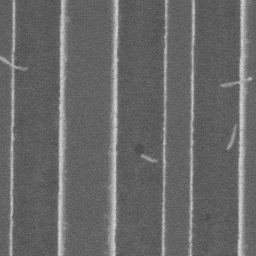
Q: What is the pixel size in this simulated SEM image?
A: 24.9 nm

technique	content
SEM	lines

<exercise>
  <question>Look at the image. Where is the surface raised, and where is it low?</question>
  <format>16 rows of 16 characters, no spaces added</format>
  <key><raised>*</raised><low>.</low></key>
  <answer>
*...***...**...*
*...***...**...*
*...***...**...*
*...***...**...*
*...***...**...*
*...***...**...*
*...***...**...*
*...***...**...*
*...***...**...*
*...***...**...*
*...***...**...*
*...***...**...*
*...***...**...*
*...***...**...*
*...***...**...*
*...***...**...*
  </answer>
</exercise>